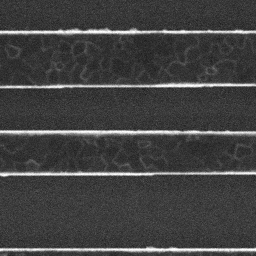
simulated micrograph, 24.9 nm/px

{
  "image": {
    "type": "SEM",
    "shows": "lines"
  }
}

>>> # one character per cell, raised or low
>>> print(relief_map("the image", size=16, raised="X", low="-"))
----------------
----------------
XXXXXXXXXXXXXXXX
XXXXXXXXXXXXXXXX
XXXXXXXXXXXXXXXX
----------------
----------------
----------------
XXXXXXXXXXXXXXXX
XXXXXXXXXXXXXXXX
XXXXXXXXXXXXXXXX
----------------
----------------
----------------
----------------
----------------